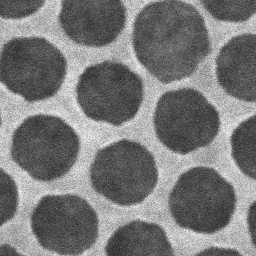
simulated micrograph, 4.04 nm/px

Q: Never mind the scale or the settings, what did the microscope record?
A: holes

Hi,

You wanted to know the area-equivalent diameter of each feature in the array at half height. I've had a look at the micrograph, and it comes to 66.4 pixels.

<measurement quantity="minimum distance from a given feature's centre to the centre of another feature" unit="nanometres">325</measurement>